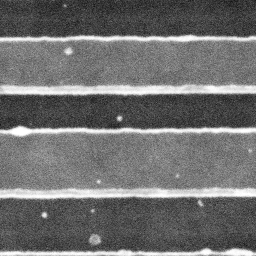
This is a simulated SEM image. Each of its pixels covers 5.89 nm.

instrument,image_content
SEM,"lines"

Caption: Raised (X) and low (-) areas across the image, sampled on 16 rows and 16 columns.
----------------
----------------
XXXXXXXXXXXXXXXX
XXXXXXXXXXXXXXXX
XXXXXXXXXXXXXXXX
XXXXXXXXXXXXXXXX
----------------
----------------
XXXXXXXXXXXXXXXX
XXXXXXXXXXXXXXXX
XXXXXXXXXXXXXXXX
XXXXXXXXXXXXXXXX
----------------
----------------
----------------
----------------